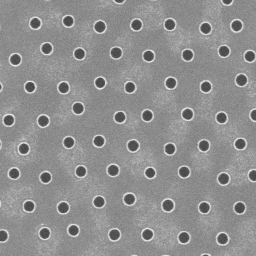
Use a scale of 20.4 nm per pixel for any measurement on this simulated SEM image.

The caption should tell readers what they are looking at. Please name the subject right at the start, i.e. a regular array of holes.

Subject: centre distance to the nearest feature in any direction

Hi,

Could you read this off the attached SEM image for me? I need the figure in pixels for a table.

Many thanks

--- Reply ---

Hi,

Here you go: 31.3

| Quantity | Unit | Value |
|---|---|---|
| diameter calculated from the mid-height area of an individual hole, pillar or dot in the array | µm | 0.229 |